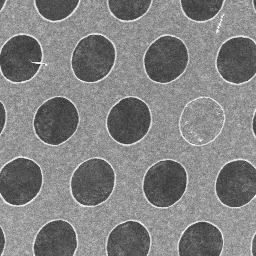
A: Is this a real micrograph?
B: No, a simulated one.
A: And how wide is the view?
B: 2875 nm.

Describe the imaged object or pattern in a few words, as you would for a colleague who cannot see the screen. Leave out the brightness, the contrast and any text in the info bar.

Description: holes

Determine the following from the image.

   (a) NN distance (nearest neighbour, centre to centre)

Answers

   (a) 804 nm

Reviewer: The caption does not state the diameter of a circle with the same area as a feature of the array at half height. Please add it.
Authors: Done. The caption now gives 0.514 microns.